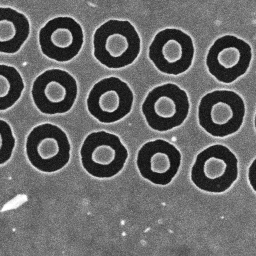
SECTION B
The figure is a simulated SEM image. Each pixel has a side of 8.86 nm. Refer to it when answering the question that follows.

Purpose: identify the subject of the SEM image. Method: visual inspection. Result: a regular array of ring-shaped grooves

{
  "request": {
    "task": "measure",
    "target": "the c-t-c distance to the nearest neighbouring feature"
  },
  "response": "487 nm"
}